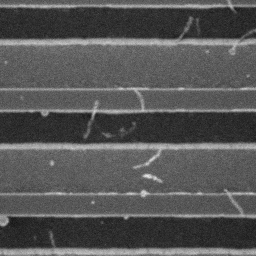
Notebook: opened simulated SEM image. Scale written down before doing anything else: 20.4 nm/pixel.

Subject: lines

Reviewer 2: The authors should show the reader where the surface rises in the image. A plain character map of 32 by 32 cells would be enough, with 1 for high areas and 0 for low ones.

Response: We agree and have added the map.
11111111111111111111111111111111
00000000000000000000000000000000
00000000000000000000000000000000
00000000000000000000000000000000
00000000000000000000000000000000
00111101111111110111011111001111
11111111111111111111111111111111
11111111111111111111111111111111
11111111111111111111111111111111
11111111111111111111111111111111
11111111111111111111111111111111
11111111111111111111111111111111
11111111111111111111111111111111
11111111111111111111111111111111
00000000000000000000000000000000
00000000000000000000000000000000
00000000000000000000000000000000
00000000000000000000000000000000
00000000000000000000100001000100
11111111111111111111111111111111
11111111111111111111111111111111
11111111111111111111111111111111
11111111111111111111111111111111
11111111111111111111111111111111
11111111111111111111111111111111
11111111111111111111111111111111
11111111111111111111111111111111
10000000000000000000000000000000
00000000000000000000000000000000
00000000000000000000000000000000
00000000000000000000000000000000
00000000000000000000000000000000